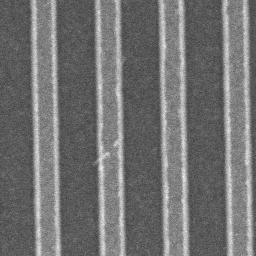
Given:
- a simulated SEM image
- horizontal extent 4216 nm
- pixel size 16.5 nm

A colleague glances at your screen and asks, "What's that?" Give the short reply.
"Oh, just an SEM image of parallel lines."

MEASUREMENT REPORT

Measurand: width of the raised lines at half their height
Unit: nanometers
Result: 340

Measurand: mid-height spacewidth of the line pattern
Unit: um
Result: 0.71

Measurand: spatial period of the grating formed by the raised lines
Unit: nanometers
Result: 1050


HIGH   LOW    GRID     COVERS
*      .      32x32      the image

....***.....***.....***.....***.
....***.....***.....***.....***.
....***.....***.....***.....***.
....***.....***.....***.....***.
....***.....***.....***.....***.
....***.....***.....***.....***.
....***.....***.....***.....***.
....***.....***.....***.....***.
....***.....***.....***.....***.
....***.....***.....***.....***.
....***.....***.....***.....***.
....***.....***.....***.....***.
....***......**.....***.....***.
....***......**.....***.....***.
.....**......**.....***.....***.
.....**.....***.....***.....***.
.....**.....***.....***.....***.
.....**.....***......**......**.
....***......**......**......**.
.....**.....***......**......**.
.....**.....***......**.....***.
.....**.....***......**......**.
.....**......**......**......**.
.....**......**......**......**.
.....**......**......**......**.
.....**......**......**......**.
.....**......**......**......**.
.....**......**......**......**.
.....**......**......**......**.
.....**......**......**......**.
.....**......**......**......**.
.....**......**......**......**.